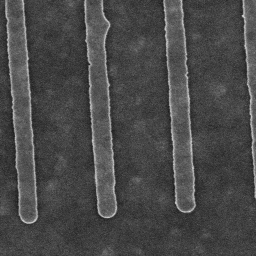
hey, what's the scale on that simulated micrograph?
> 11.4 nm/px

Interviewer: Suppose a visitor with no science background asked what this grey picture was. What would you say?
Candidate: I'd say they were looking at one or a few lines or trenches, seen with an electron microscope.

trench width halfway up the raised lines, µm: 0.689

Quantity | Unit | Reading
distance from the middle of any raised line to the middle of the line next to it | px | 78.8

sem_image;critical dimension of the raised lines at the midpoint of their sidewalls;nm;214